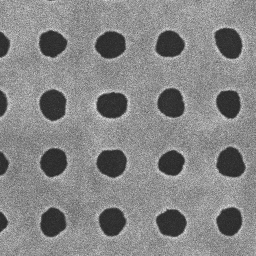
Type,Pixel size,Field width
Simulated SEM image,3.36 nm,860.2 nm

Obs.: a regular array of holes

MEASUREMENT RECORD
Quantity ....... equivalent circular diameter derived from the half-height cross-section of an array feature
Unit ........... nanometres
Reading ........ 93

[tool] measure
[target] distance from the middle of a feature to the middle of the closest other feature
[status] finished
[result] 196 nanometres